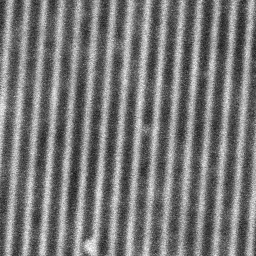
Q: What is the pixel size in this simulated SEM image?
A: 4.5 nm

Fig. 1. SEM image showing parallel lines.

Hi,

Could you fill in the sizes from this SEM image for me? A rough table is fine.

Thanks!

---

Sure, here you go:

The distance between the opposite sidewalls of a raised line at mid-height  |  16.2 nanometers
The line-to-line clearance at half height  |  61.6 nm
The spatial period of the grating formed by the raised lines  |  77.3 nm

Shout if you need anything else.